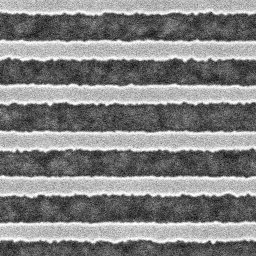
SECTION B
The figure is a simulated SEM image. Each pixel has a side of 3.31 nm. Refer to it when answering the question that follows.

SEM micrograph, lines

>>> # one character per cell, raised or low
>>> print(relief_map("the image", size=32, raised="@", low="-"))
@@@@@@@@@@@@@@@@@@@@@@@@@@@@@@@@
-@@@@@@@@@@@@-@@@@@@@@@@@@@@@@@@
--------------------------------
--------------------------------
--------------------------------
@@@@@@@@@@@@@@@@@@@@@@@@@@@@@@@@
@@@@@@@@@@@@@@@@@@@@@@@@@@@@@@@@
-----@--------------@----@------
--------------------------------
--------------------------------
--------------------------------
@@@@@@@@@@@@@@@@@@@@@@@@@@@@@@@@
@@@@@@@@@@@@@@@@@@@@@@@@@@@@@@@@
--------------------------------
--------------------------------
--------------------------------
@@--@@@-------@------@-@---@----
@@@@@@@@@@@@@@@@@@@@@@@@@@@@@@@@
@@@@@@@@@@@@@@@@@@@@@@@@@@@@@@@@
--------------------------------
--------------------------------
--------------------------------
@@@@@@@@@@@@@@@@@@@@@@@@@@@@@@@@
@@@@@@@@@@@@@@@@@@@@@@@@@@@@@@@@
--------------------------------
--------------------------------
--------------------------------
--------------------------------
@@@@@@@@@@@@@@@@@@@@@@@@@@@@@@@@
@@@@@@@@@@@@@@@@@@@@@@@@@@@@@@@@
--------------------------------
--------------------------------